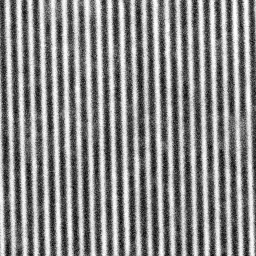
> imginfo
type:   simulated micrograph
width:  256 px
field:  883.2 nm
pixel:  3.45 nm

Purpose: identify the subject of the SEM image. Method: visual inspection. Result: parallel lines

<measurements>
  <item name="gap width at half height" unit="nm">29.7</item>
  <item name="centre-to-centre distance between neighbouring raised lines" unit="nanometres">39.2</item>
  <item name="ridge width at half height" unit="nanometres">9.1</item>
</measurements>